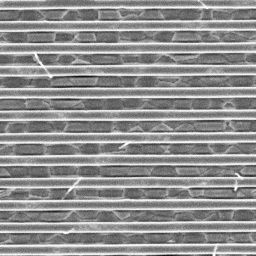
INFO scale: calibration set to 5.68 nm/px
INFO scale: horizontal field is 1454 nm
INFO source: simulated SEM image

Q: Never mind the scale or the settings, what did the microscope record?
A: parallel lines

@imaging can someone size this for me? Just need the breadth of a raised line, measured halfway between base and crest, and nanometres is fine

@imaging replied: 55.4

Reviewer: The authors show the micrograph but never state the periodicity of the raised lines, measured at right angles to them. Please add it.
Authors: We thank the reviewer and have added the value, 127 nm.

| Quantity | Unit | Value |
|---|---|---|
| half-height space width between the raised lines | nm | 75.3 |